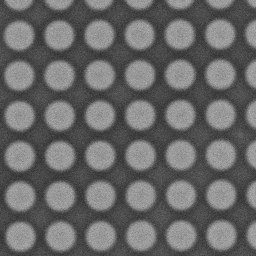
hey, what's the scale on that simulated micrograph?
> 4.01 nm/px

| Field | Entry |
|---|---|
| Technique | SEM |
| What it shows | an array of small figures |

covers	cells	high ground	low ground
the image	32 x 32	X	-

-XXX--XXX--XXX--XXX--XXX--XXX--X
--------------------------------
--------------------------------
-XXX--XXX--XXX--XXX--XXX--XXX--X
-XXX--XXX--XXX--XXX--XXX--XXX--X
-XXX--XXX--XXX--XXX--XXX--XXX--X
--------------------------------
--------------------------------
-XXX--XXX--XXX--XXX--XXX--XXX--X
-XXX--XXX--XXX--XXX--XXX--XXX--X
-XXX--XXX--XXX--XXX--XXX--XXX--X
--------------------------------
--------------------------------
-XXX--XXX--XXX--XXX--XXX--XXX--X
-XXX--XXX--XXX--XXX--XXX--XXX--X
-XXX--XXX--XXX--XXX--XXX--XXX--X
--------------------------------
--------------------------------
-XXX--XXX--XXX--XXX--XXX--XXX--X
-XXX--XXX--XXX--XXX--XXX--XXX--X
-XXX--XXX--XXX--XXX--XXX--XXX--X
--------------------------------
--------------------------------
-XXX--XXX--XXX--XXX--XXX--XXX--X
-XXX--XXX--XXX--XXX--XXX--XXX--X
-XXX--XXX--XXX--XXX--XXX--XXX--X
--------------------------------
--------------------------------
-XXX--XXX--XXX--XXX--XXX--XXX--X
-XXX--XXX--XXX--XXX--XXX--XXX--X
-XXX--XXX--XXX--XXX--XXX--XXX--X
--------------------------------